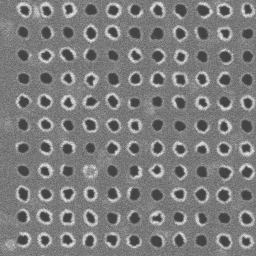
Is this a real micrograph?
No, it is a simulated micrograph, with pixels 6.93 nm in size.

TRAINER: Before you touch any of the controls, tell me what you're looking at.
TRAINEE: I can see a regular array of holes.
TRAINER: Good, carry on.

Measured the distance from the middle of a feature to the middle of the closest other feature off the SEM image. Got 152 nanometers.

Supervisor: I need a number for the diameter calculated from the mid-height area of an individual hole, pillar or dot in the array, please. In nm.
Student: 71.2